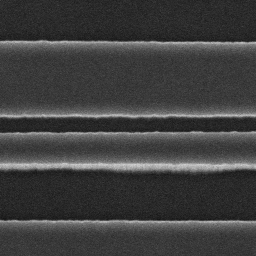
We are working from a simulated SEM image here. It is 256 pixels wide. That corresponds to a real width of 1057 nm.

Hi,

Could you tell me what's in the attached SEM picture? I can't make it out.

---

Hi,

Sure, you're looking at lines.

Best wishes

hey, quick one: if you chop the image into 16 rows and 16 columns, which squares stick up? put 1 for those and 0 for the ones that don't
0000000000000000
0000000000000000
0000000000000000
1111111111111111
1111111111111111
1111111111111111
1111111111111111
1111111111111111
1111111111111111
1111111111111111
0000000000000000
0000000000000000
0000000000000000
0000000000000000
1111111111111111
1111111111111111